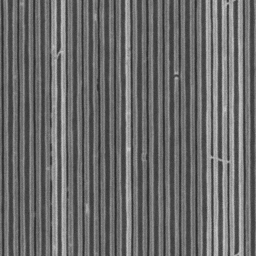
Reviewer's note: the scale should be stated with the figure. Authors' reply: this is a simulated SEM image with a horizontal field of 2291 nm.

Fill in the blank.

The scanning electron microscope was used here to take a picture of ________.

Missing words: parallel lines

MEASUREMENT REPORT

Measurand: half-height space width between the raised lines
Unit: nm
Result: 45.8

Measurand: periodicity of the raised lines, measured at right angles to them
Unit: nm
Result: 72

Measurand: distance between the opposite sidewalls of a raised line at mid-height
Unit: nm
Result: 38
